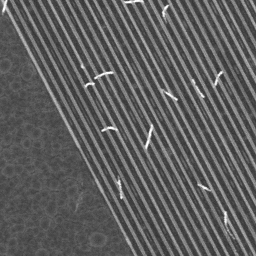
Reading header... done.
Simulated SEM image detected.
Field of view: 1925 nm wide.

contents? parallel lines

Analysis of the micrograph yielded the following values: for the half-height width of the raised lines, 20.8 nm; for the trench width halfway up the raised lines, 5.65 px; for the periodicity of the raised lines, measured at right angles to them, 8.15 pixels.